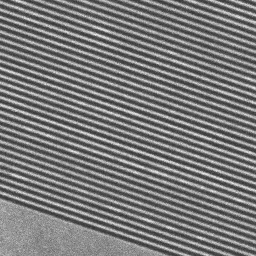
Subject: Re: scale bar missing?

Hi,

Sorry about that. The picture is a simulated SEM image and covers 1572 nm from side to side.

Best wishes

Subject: parallel lines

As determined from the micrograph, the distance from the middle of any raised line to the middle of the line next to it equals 42.5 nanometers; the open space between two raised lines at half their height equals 29.8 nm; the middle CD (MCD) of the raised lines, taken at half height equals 12.4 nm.